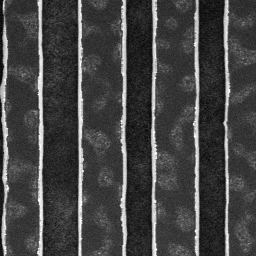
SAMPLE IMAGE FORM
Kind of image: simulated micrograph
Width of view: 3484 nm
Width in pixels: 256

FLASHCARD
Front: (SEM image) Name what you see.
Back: one or a few lines or trenches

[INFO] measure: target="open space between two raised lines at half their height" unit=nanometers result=398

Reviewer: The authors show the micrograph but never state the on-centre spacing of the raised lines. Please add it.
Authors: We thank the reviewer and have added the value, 1040 nm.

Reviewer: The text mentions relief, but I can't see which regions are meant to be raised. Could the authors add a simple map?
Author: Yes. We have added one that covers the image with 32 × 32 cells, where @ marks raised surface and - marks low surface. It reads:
@@@@@-----@@@@@@---@@@@@@---@@@@
@@@@@-----@@@@@@---@@@@@@---@@@@
-@@@@-----@@@@@@---@@@@@@---@@@@
-@@@@-----@@@@@@---@@@@@@---@@@@
-@@@@-----@@@@@@---@@@@@@---@@@@
-@@@@-----@@@@@@---@@@@@@---@@@@
-@@@@-----@@@@@@---@@@@@@---@@@@
-@@@@-----@@@@@@---@@@@@@---@@@@
-@@@@-----@@@@@@---@@@@@@---@@@@
-@@@@-----@@@@@@---@@@@@@---@@@@
@@@@@-----@@@@@@---@@@@@@---@@@@
@@@@@-----@@@@@@---@@@@@@----@@@
@@@@@-----@@@@@@---@@@@@@---@@@@
@@@@@-----@@@@@----@@@@@@---@@@@
@@@@@-----@@@@@@---@@@@@@---@@@@
@@@@@-----@@@@@----@@@@@@---@@@@
-@@@@-----@@@@@----@@@@@@---@@@@
-@@@@-----@@@@@----@@@@@@---@@@@
-@@@@-----@@@@@----@@@@@@---@@@@
-@@@@-----@@@@@@---@@@@@@---@@@@
-@@@@-----@@@@@@---@@@@@@---@@@@
@@@@@-----@@@@@@---@@@@@@---@@@@
-@@@@-----@@@@@@---@@@@@@---@@@@
-@@@@-----@@@@@@---@@@@@@---@@@@
-@@@@-----@@@@@----@@@@@@---@@@@
-@@@@-----@@@@@----@@@@@@---@@@@
-@@@@-----@@@@@----@@@@@@---@@@@
-@@@@-----@@@@@----@@@@@@---@@@@
@@@@@-----@@@@@@---@@@@@@---@@@@
@@@@@-----@@@@@@---@@@@@@---@@@@
@@@@@-----@@@@@@---@@@@@@---@@@@
-@@@@-----@@@@@----@@@@@@---@@@@